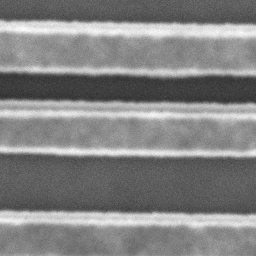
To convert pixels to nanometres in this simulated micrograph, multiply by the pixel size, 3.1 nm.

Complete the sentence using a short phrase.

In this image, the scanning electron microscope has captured lines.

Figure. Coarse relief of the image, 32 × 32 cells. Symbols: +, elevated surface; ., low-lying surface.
................................
................................
................................
++++++++++++++++++++++++++++++++
++++++++++++++++++++++++++++++++
++++++++++++++++++++++++++++++++
++++++++++++++++++++++++++++++++
++++++++++++++++++++++++++++++++
++++++++++++++++++++++++++++++++
................................
................................
................................
................................
++++++++++++++++++++++++++++++++
++++++++++++++++++++++++++++++++
++++++++++++++++++++++++++++++++
++++++++++++++++++++++++++++++++
++++++++++++++++++++++++++++++++
++++++++++++++++++++++++++++++++
................................
................................
................................
................................
................................
................................
................................
++..............................
++++++++++++++++++++++++++++++++
++++++++++++++++++++++++++++++++
++++++++++++++++++++++++++++++++
++++++++++++++++++++++++++++++++
++++++++++++++++++++++++++++++++